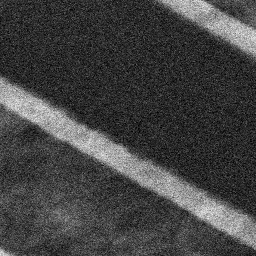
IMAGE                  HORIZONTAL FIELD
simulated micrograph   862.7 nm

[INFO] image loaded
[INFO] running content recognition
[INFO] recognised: one or a few lines or trenches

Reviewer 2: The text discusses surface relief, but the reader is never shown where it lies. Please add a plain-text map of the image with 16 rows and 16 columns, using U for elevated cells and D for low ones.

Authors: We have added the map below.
DDDDDDDDDDDDUUUU
DDDDDDDDDDDDDDUU
DDDDDDDDDDDDDDDD
DDDDDDDDDDDDDDDD
DDDDDDDDDDDDDDDD
DDDDDDDDDDDDDDDD
UDDDDDDDDDDDDDDD
UUUDDDDDDDDDDDDD
UUUUUDDDDDDDDDDD
UUUUUUUDDDDDDDDD
UUUUUUUUDDDDDDDD
UUUUUUUUUUDDDDDD
UUUUUUUUUUUUDDDD
UUUUUUUUUUUUUUDD
UUUUUUUUUUUUUUUD
UUUUUUUUUUUUUUUU